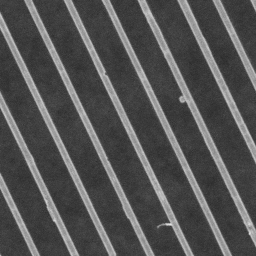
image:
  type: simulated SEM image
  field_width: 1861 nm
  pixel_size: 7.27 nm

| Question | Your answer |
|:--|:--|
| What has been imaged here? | parallel lines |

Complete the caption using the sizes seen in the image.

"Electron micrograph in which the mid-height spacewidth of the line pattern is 204 nanometers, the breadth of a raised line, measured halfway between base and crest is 47.5 nm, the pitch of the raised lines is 249 nanometres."